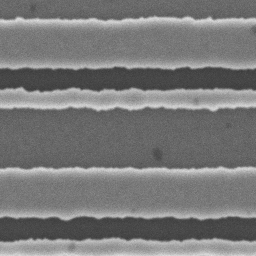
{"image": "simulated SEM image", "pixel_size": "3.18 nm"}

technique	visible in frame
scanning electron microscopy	lines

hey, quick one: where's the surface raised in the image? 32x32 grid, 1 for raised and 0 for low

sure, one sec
00000000000000000000000000000000
00000000000000000000000000000000
11111111111100011111111111111111
11111111111111111111111111111111
11111111111111111111111111111111
11111111111111111111111111111111
11111111111111111111111111111111
11111111111111111111111111111111
01101010110110001000110010000111
00000000000000000000000000000000
00000000000000000000000000000000
11111111111111111111111111111111
11111111111111111111111111111111
00000000000011001100000010100000
00000000000000000000000000000000
00000000000000000000000000000000
00000000000000000000000000000000
00000000000000000000000000000000
00000000000000000000000000000000
00000000000000000000000000000000
00000000000000000000000000000000
11111111111111111111111111111111
11111111111111111111111111111111
11111111111111111111111111111111
11111111111111111111111111111111
11111111111111111111111111111111
11111111111111111111111111111111
00000000100000000000000000000000
00000000000000000000000000000000
00000000000000000000000000000000
11111111111111111111111111111111
11111111111111111111111111111111